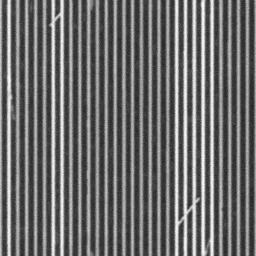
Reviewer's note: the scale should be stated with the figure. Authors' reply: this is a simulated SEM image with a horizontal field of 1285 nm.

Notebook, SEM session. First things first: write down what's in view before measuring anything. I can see parallel lines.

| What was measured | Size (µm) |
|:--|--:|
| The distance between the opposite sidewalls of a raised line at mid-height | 0.0132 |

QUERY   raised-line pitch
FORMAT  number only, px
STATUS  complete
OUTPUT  8.82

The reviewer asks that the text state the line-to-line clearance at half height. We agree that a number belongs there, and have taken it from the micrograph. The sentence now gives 0.0307 microns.